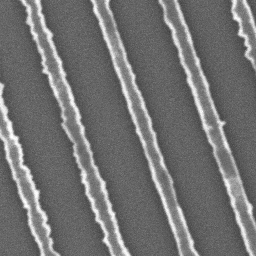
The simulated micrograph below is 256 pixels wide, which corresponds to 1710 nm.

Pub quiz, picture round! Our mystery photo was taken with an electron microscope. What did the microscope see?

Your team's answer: one or a few lines or trenches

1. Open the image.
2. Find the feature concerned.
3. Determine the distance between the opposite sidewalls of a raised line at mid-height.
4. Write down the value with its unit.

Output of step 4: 102 nm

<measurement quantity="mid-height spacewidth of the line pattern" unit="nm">337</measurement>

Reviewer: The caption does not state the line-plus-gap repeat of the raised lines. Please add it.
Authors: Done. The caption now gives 439 nanometres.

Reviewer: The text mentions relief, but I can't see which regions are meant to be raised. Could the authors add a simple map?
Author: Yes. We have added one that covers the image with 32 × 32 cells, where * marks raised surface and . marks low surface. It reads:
...**.......**......**.......**.
....*.......**.......**......**.
....*.......**.......**......***
....**.......**......**.......**
....**.......**.......**......**
.....**......**.......**.......*
.....**.......**......**.......*
.....**.......**.......**......*
.....***......**.......**.......
......**.......**.......**......
......**.......**.......**......
.......**......**.......**......
.......**.......**......**......
*.......**......**.......**.....
*.......**......***......**.....
*.......**.......**......***....
**......**.......**.......**....
**.......**.......**......**....
.**......**.......**.......**...
.**......**.......**.......**...
.**.......**.......**......**...
..**......**.......**.......**..
..**......***......**.......**..
..**.......**.......**......**..
...**......**.......**.......**.
...**......***......**.......**.
....*.......**.......**......**.
....**......**.......**.......**
....**.......**.......*.......**
....**.......**.......**......**
.....*.......**.......**.......*
.....**.......**......***......*